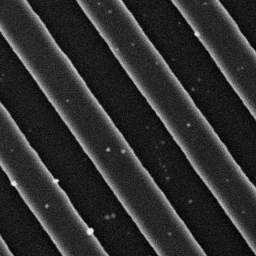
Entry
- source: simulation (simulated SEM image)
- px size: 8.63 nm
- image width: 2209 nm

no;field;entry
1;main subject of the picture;lines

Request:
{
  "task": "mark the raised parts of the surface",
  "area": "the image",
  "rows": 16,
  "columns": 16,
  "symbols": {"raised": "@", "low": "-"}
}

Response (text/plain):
@@---@@@---@@@--
@@@---@@@---@@@-
@@@----@@---@@@-
-@@@---@@@---@@@
--@@@---@@@---@@
---@@@---@@----@
---@@@---@@@---@
@---@@@---@@@---
@----@@@---@@@--
@@---@@@---@@@--
@@@---@@@---@@@-
-@@@---@@@---@@@
-@@@---@@@----@@
--@@@---@@@---@@
---@@@---@@@---@
----@@----@@@---